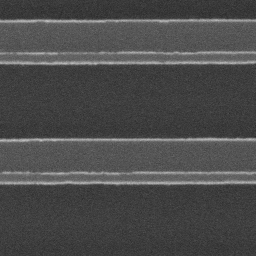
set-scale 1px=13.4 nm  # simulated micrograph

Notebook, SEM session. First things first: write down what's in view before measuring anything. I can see lines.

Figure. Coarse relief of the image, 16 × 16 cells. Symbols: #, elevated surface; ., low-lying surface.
................
################
################
################
................
................
................
................
................
################
################
................
................
................
................
................